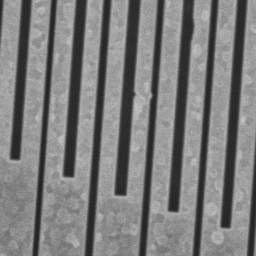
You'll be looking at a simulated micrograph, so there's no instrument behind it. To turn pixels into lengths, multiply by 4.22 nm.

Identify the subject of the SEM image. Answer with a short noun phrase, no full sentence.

parallel lines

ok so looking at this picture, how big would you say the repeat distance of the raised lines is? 113 nm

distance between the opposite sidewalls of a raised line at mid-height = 0.0762 um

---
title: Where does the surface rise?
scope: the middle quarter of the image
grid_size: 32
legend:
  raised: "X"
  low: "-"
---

XX---XXXX--XXXX---XXXX--XXXXX---
XX---XXX---XXXX---XXXX--XXXX---X
X---XXXX---XXXX---XXXX--XXXX---X
X---XXXX--XXXXX---XXXX--XXXX---X
X---XXXX--XXXXX---XXXX--XXXX---X
X---XXXX--XXXX----XXXX--XXXX---X
X---XXXX--XXXX----XXXX-XXXXX---X
X---XXXX--XXXX----XXXX-XXXXX---X
X---XXXX--XXXX----XXXX-XXXXX---X
X---XXXX--XXXX---XXXX--XXXXX---X
X---XXXX--XXXX---XXXX--XXXXX---X
X---XXXX--XXXX---XXXX--XXXXX---X
X---XXXX--XXXX---XXXX--XXXXX---X
X---XXXX--XXXX---XXXX--XXXXX---X
X---XXXX--XXXX---XXXX--XXXX---XX
X---XXX---XXXX---XXXX--XXXX---XX
---XXXX---XXXX---XXXX--XXXX---XX
---XXXX--XXXXX---XXXX--XXXX---XX
---XXXX--XXXXX---XXXX--XXXX---XX
---XXXX--XXXX----XXXX--XXXX---XX
---XXXX--XXXX----XXXX-XXXXX---XX
---XXXX--XXXX----XXX--XXXXX---XX
---XXXX--XXXX---XXXX--XXXXX---XX
---XXXX--XXXX---XXXX--XXXXX---XX
---XXXX--XXXX---XXXX--XXXXX---XX
---XXXX--XXXX---XXXX--XXXXX---XX
---XXXX--XXXX---XXXX--XXXXX---XX
---XXXX--XXXX---XXXX--XXXXX---XX
XXXXXX---XXXX---XXXX--XXXX---XXX
XXXXXX---XXXX---XXXX--XXXX---XXX
XXXXXX--XXXXX---XXXX--XXXX---XXX
XXXXXX--XXXXX---XXXX--XXXX---XXX